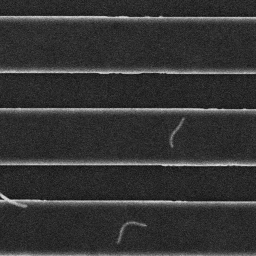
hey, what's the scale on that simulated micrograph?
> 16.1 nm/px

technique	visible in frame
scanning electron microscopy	lines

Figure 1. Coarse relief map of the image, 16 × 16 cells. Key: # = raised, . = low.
................
################
################
################
################
................
................
################
################
################
................
................
#...............
################
################
################